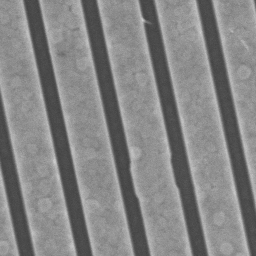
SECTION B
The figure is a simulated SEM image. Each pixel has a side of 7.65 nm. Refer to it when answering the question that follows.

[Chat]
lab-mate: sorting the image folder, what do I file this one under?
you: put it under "parallel lines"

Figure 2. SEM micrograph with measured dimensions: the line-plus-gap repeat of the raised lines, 432 nm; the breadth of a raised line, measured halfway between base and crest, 317 nm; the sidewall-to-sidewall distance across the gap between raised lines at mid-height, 115 nm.